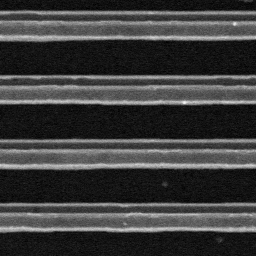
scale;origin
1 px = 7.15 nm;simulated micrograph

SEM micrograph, lines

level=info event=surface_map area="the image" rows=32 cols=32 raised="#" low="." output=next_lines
................................
................................
################################
################################
################################
................................
................................
................................
................................
................................
################################
################################
################################
................................
................................
................................
................................
................................
################################
################################
################################
................................
................................
................................
................................
................................
################################
################################
################################
................................
................................
................................